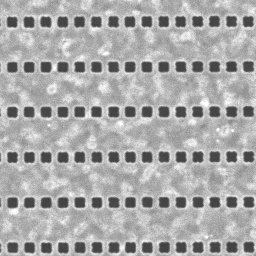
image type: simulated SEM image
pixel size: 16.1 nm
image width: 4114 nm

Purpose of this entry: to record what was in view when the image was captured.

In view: a regular array of holes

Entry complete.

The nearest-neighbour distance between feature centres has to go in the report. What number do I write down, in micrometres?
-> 0.27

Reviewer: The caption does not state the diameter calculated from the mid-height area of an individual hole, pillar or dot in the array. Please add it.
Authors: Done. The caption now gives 195 nm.